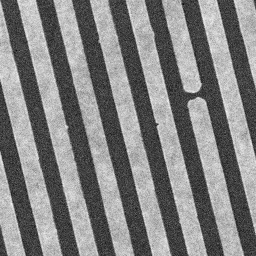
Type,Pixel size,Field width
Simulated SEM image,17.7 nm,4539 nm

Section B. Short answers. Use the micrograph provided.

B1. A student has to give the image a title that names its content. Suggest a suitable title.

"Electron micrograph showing parallel lines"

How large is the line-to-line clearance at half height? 329 nm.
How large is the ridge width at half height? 301 nanometres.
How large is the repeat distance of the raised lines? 623 nm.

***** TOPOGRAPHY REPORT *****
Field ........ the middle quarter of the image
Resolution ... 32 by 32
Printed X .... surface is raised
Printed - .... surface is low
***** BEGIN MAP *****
--XXXX-----XXXX-----XXXX-----XXX
--XXXX-----XXXX-----XXXX-----XXX
--XXXX-----XXXX-----XXXX-----XXX
--XXXXX----XXXXX----XXXXX----XXX
---XXXX-----XXXX-----XXXX-----XX
---XXXX-----XXXX-----XXXX-----XX
---XXXX-----XXXX-----XXXX------X
---XXXXX----XXXXX----XXXXX------
----XXXX-----XXXX-----XXXX------
----XXXX-----XXXX-----XXXX-----X
----XXXX-----XXXX-----XXXX-----X
----XXXXX----XXXXX----XXXXX----X
----XXXXX-----XXXX-----XXXX-----
-----XXXX-----XXXX-----XXXX-----
-----XXXX-----XXXX-----XXXX-----
-----XXXXX----XXXXX-----XXXX----
X----XXXXX-----XXXX-----XXXX----
X-----XXXX-----XXXX-----XXXX----
X-----XXXX-----XXXX-----XXXX----
X-----XXXXX----XXXX-----XXXXX---
XX----XXXXX-----XXXX-----XXXX---
XX-----XXXX-----XXXX-----XXXX---
XX-----XXXX-----XXXX-----XXXX---
XX-----XXXX-----XXXXX----XXXXX--
XXX----XXXXX-----XXXX-----XXXX--
XXX-----XXXX-----XXXX-----XXXX--
XXX-----XXXX-----XXXX-----XXXX--
XXX-----XXXX-----XXXX-----XXXXX-
XXXX----XXXXX-----XXXX-----XXXX-
XXXX-----XXXX-----XXXX-----XXXX-
XXXX-----XXXX-----XXXX-----XXXX-
XXXX-----XXXX-----XXXX-----XXXXX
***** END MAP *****